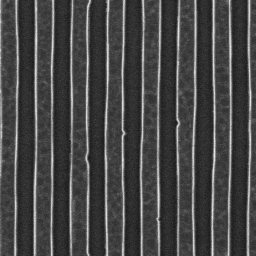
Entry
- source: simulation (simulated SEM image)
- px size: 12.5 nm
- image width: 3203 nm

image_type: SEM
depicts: parallel lines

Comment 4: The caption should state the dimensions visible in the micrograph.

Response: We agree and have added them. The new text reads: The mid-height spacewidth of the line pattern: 239 nm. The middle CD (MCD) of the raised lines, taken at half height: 203 nm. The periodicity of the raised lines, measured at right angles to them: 0.445 microns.